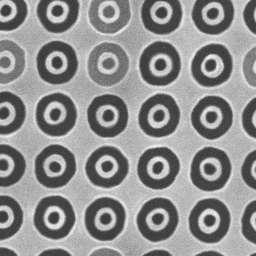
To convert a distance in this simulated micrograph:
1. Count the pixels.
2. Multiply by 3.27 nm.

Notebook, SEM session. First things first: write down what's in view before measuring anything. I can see a regular array of ring-shaped grooves with a dot in the middle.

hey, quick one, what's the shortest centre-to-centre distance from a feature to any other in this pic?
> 168 nanometers